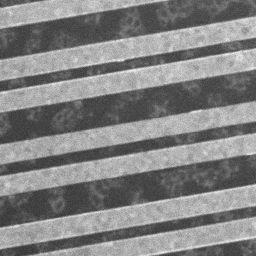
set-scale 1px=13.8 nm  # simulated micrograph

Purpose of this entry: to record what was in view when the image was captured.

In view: parallel lines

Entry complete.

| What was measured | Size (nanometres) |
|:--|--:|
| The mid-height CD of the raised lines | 272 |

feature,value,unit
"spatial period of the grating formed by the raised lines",0.569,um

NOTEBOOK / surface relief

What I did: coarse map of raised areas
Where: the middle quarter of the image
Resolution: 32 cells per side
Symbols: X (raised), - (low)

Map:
XXXXX------------------XXXXXXXXX
-----------------XXXXXXXXXXXXXXX
-----------XXXXXXXXXXXXXXXXXXXXX
-----XXXXXXXXXXXXXXXXXXXXXXXXXXX
XXXXXXXXXXXXXXXXXXXXXXXXXXXX----
XXXXXXXXXXXXXXXXXXXXXX----------
XXXXXXXXXXXXXXXX----------------
XXXXXXXXXX-------X--------------
XXXXX---------------------------
---X----------------------------
--------------------------------
----X---------------------------
------------------------------XX
X-----------------------XXXXXXXX
XXX---------------XXXXXXXXXXXXXX
------------XXXXXXXXXXXXXXXXXXXX
------XXXXXXXXXXXXXXXXXXXXXXXXXX
-XXXXXXXXXXXXXXXXXXXXXXXXXXX----
XXXXXXXXXXXXXXXXXXXXXX---------X
XXXXXXXXXXXXXXXX----------------
XXXXXXXXXX--------------------XX
XXXX--------------------XXXXXXXX
------------------XXXXXXXXXXXXXX
------------XXXXXXXXXXXXXXXXXXXX
------XXXXXXXXXXXXXXXXXXXXXXXXXX
XXXXXXXXXXXXXXXXXXXXXXXXXXXX----
XXXXXXXXXXXXXXXXXXXXXX----------
XXXXXXXXXXXXXXXX----------XX----
XXXXXXXXXX----------------XX-X--
XXXX----------------------------
--------------------------------
--------------------------------